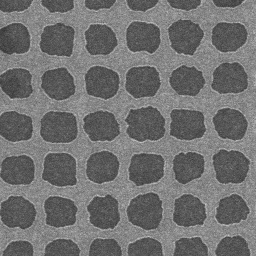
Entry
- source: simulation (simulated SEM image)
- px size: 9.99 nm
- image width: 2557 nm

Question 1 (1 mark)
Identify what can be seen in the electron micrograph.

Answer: a regular array of holes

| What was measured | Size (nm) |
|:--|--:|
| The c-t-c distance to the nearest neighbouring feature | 421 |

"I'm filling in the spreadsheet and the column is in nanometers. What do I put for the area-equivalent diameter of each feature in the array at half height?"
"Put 348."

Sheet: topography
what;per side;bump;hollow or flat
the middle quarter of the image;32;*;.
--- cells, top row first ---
*******...*********...*******..*
.*****......****.......****.....
..***.........*.........***.....
..***.........*.........**......
...**.........*.........**......
...**.........*.........***.....
...**.........*.........***.....
..****.......***.......*****....
.*******....*****...************
********************************
*********************.**********
*********.*******.......***....*
..****......****........**......
...**........**..........**.....
...**........**...........*.....
...**.........**.........*......
....*.........**.........*......
....*.........**.........*......
...***.......****........***....
..*********.*******.************
********************************
**********.*********************
..*****......****......*****....
...***........***........**.....
...**.........**.........**.....
...***........**.........**.....
...**.........**.........**.....
...**.........**.........**.....
...***.......***.........***....
...****....******......*****...*
..****************.*************
********************************